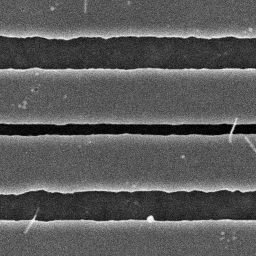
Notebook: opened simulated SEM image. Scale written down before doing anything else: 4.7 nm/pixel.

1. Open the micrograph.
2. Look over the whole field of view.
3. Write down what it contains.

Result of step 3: lines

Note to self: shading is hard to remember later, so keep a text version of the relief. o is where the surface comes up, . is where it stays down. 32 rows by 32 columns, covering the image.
oooooooooooooooooooooooooooooooo
oooooooooooooooooooooooooooooooo
oooooooooooooooooooooooooooooooo
oooooooooooooooooooooooooooooooo
.oooooooooooooo..o.ooooooooooooo
................................
................................
................................
................................
oooooooooooooooooooooooooooooooo
oooooooooooooooooooooooooooooooo
oooooooooooooooooooooooooooooooo
oooooooooooooooooooooooooooooooo
oooooooooooooooooooooooooooooooo
oooooooooooooooooooooooooooooooo
.......o.............oo...o..o..
................................
oooooooooooooooooooooooooooooooo
oooooooooooooooooooooooooooooooo
oooooooooooooooooooooooooooooooo
oooooooooooooooooooooooooooooooo
oooooooooooooooooooooooooooooooo
oooooooooooooooooooooooooooooooo
oooooooooooooooooooooooooooooooo
................................
................................
................................
....o...........o.oo........o...
oooooooooooooooooooooooooooooooo
oooooooooooooooooooooooooooooooo
oooooooooooooooooooooooooooooooo
oooooooooooooooooooooooooooooooo